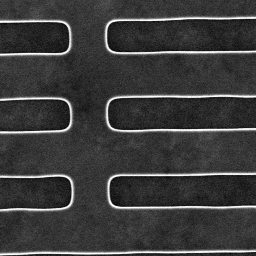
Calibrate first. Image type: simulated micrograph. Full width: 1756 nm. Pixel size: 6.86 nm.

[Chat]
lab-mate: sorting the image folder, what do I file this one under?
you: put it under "groups of lines, slits or small figures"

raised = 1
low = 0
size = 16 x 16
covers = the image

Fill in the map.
1111111111111111
0000111000000000
0000111000000000
1111111111111111
1111111111111111
1111111111111111
0000111000000000
0000111000000000
1111111111111111
1111111111111111
1111111111111111
0000111000000000
0000111000000000
1111111111111111
1111111111111111
1111111111111111